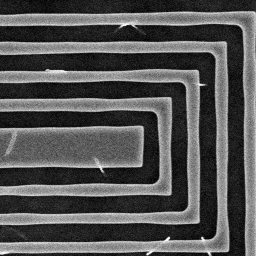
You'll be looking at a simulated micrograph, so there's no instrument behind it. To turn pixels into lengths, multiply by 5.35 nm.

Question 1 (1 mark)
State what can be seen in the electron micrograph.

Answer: groups of lines, slits or small figures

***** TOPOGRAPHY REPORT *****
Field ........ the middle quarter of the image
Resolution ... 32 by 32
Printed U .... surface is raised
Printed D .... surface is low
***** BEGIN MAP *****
DDDDDDDDDDDDDDDDDDDDDDDDDDDDDDDD
DDDDDDDDDDDDDDDDDDDDDUUUUDDDDDDD
UUUUUUUUUUUUUUUUUUUUUUUUUUUUUUUU
UUUUUUUUUUUUUUUUUUUUUUUUUUUUUUUU
DDDDDDDDDDDDDDDDDDDDDDDDDDDDDUUU
DDDDDDDDDDDDDDDDDDDDDDDDDDDDDDDU
DDDDDDDDDDDDDDDDDDDDDDDDDDDDDDDU
DDDDDDDDDDDDDDDDDDDDDDDDDDDDDDDU
DDDDDDDDDDDDDDDDDDDDDDDDDDDDDDDU
UUUUUUUUUUUUUUUUUUUUUUUUUUUDDDDU
UUUUUUUUUUUUUUUUUUUUUUUUUUUDDDDU
DUUUUUUUUUDDDDDDDDDDUUUUUUUDDDDU
DDDDDDDDDDDDDDDDDDDDDDDUUUUDDDDU
DDDDDDDDDDDDDDDDDDDDDDDDUUUDDDDU
DDDDDDDDDDDDDDDDDDDDDDDDUUUDDDDU
DDDDDDDDDDDDDDDDDDDDDDDDUUUDDDDU
UUUUUUUUUUUUUUUUUUUUDDDDUUUDDDDU
UUUUUUUUUUUUUUUUUUUUDDDDUUUDDDDU
UUUUUUUUUUUUUUUUUUUUDDDDUUUDDDDU
UUUUUUUUUUUUUUUUUUUUDDDDUUUDDDDU
UUUUUUUUUUUUUUUUUUUUDDDDUUDDDDDU
UUUUUUUUUUUUUUUUUUUUDDDDUUDDDDDU
UUUUUUUUUUUUUUUUUUUDDDDDUUUDDDDU
UUUUUUUUUUUUUUUUUUUDDDDDUUUDDDDU
UUUUUUUUUUUUUUUUUUUDDDDDUUUDDDDU
UUUUUUUUUUUUUUUUUUUDDDDDUUUDDDDU
DDDDDDDDDDDDDDDDDDDDDDDDUUUDDDDU
DDDDDDDDDDDDDDDDDDDDDDDDUUUDDDDU
DDDDDDDDDDDDDDDDDDDDDDDDUUUDDDDU
DDDDDDDDDDDDDDDDDDDDDDDUUUUDDDDU
UUUUUUUUUUUUUUUUUUUUUUUUUUUDDDDU
UUUUUUUUUUUUUUUUUUUUUUUUUUUDDDDU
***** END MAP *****